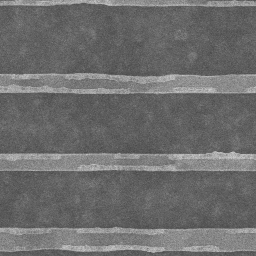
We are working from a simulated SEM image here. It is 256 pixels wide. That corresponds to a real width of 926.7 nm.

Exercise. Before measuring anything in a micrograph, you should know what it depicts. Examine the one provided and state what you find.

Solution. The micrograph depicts one or a few lines or trenches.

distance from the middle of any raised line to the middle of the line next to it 281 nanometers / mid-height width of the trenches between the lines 222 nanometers